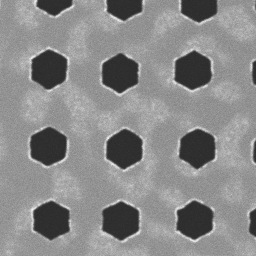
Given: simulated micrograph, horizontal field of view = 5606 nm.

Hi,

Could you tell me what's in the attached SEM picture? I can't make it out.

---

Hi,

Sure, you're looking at a regular array of holes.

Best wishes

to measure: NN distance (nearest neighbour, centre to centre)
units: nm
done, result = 1570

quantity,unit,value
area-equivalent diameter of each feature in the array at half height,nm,833